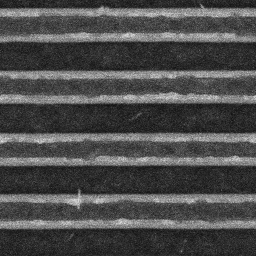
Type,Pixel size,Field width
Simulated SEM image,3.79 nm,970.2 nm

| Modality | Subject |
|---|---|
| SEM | one or a few lines or trenches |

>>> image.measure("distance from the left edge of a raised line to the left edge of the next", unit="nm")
236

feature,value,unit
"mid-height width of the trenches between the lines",130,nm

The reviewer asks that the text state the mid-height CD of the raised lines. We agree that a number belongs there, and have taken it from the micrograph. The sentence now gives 105 nm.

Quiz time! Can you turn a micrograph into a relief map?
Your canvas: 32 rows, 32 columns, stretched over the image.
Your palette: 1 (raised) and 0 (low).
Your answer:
00000000000000000000000000000000
00000000000011000000001111111111
11111111111111111111111111111111
11111111111111111111111111111111
11111111111111111111111111111111
00000000000000000000000000000000
00000000000000000000000000000000
00000000000000000000000000000000
00000000000000000000000000000000
11111111111111111111111111111111
11111111111111111111111111111111
11111111111111111111111111111111
11001000000000000000000000000000
00000000000000000000000000000000
00000000000000000000000000000000
00000000000000000000000000000000
00000000000000000000000000000000
11111111111111111111111111111111
11111111111111111111111111111111
11111111111111111111111111111111
00000000000000000000000000000000
00000000000000000000000000000000
00000000000000000000000000000000
00000000000000000000000000000000
00000000000000000000000000000000
11111111111111111111111111111111
11111111111111111111111111111111
11111111111111111111111111111111
00000000000000000000000000000000
00000000000000000000000000000000
00000000000000000000000000000000
00000000000000000000000000000000